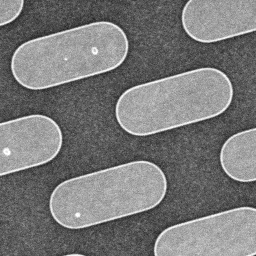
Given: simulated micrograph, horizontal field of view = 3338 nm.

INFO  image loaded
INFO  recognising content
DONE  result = groups of lines, slits or small figures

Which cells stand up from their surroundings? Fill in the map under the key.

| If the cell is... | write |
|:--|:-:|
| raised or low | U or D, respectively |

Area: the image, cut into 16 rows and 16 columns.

UDDDDDDDDDDDUUUU
DDDDDDUDDDDDUUUU
DDUUUUUUDDDDUUDD
DUUUUUUUDDDDDDDD
DUUUUUDDDDDDUUDD
DDUDDDDDUUUUUUDD
DDDDDDDUUUUUUUDD
DUUDDDDUUUUUUDDD
UUUUDDDDDDDDDDDU
UUUUDDDDDDDDDDUU
UUDDDDDUUUDDDDUU
DDDDUUUUUUDDDDDD
DDDUUUUUUUDDDDDD
DDDUUUUUDDDDDUUU
DDDDDDDDDDUUUUUU
DDDDDDDDDDUUUUUU